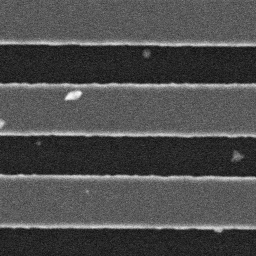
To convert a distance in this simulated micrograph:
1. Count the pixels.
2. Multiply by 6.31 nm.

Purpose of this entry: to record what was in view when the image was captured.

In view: lines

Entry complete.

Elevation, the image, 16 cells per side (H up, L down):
HHHHHHHHHHHHHHHH
HHHHHHHHHHHHHHHH
HHHHHHHHHHHHHHHH
LLLLLLLLLLLLLLLL
LLLLLLLLLLLLLLLL
HHHHHHHHHHHHHHHH
HHHHHHHHHHHHHHHH
HHHHHHHHHHHHHHHH
LLLLLLLLLLLHLLHH
LLLLLLLLLLLLLLLL
LLLLLLLLLLLLLLLL
HHHHHHHHHHHHHHHH
HHHHHHHHHHHHHHHH
HHHHHHHHHHHHHHHH
LLLLLLLLLLLLLLLL
LLLLLLLLLLLLLLLL